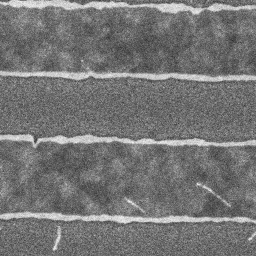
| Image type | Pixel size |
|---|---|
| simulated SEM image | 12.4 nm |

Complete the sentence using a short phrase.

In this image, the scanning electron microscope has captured one or a few lines or trenches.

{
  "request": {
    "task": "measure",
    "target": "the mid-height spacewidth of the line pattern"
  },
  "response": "799 nm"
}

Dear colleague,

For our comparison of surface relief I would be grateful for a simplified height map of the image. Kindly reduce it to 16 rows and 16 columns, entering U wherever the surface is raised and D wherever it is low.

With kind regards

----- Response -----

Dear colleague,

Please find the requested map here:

UUUUUUUUUUUDDUUU
UUUUUUUUUUUUUUUU
UUUUUUUUUUUUUUUU
UUUUUUUUUUUUUUUU
UUUUUUUUUUUUUUUU
DDDDDDDDDDDDDDDD
DDDDDDDDDDDDDDDD
DDDDDDDDDDDDDDDD
DDDDDDDDDDDDDDDD
UUUUUUUUUUUUUUUU
UUUUUUUUUUUUUUUU
UUUUUUUUUUUUUUUU
UUUUUUUUUUUUUUUU
UDDUUUUUUUUUUUUU
DDDDDDDDDDDDDDDD
DDDDDDDDDDDDDDDD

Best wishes